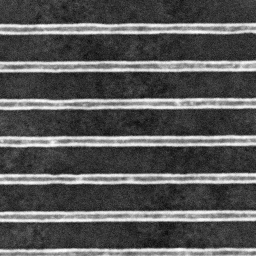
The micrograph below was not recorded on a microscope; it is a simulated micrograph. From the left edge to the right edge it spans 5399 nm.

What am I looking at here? parallel lines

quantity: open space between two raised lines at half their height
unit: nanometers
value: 633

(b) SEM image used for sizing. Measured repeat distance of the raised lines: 790 nm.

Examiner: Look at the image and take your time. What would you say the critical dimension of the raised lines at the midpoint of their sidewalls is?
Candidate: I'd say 7.25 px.